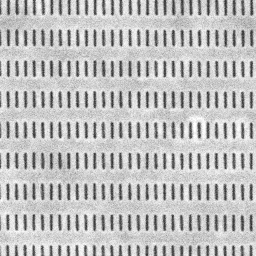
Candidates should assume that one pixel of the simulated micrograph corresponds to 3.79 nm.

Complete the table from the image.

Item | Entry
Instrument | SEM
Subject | a regular array of holes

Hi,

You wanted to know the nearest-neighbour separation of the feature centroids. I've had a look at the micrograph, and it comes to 32.2 nanometers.